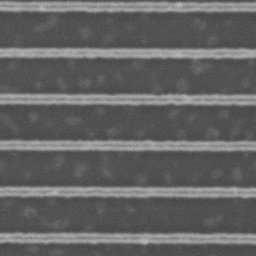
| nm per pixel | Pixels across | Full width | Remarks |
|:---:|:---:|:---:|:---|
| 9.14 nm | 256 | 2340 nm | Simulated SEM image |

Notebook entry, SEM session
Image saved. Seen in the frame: parallel lines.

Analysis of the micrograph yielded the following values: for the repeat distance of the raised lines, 423 nm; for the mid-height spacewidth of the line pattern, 39.2 pixels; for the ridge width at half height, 0.0617 micrometres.